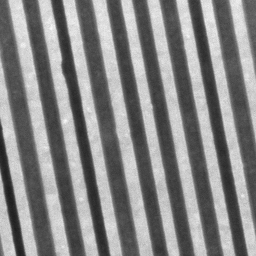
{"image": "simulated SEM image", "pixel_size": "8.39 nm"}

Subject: parallel lines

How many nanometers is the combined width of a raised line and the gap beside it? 227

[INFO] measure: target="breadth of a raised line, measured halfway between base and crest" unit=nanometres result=107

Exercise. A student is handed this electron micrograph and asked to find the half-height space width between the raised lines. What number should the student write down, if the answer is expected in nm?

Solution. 114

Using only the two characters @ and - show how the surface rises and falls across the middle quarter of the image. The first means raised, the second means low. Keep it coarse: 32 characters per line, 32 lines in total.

---@@@----@@@@---@@@----@@@----@
---@@@----@@@@---@@@----@@@----@
---@@@----@@@@----@@----@@@----@
---@@@-----@@@----@@@---@@@@----
@--@@@@----@@@----@@@---@@@@----
@---@@@----@@@@---@@@----@@@----
@---@@@----@@@@---@@@----@@@----
@---@@@----@@@@---@@@@---@@@----
@---@@@-----@@@----@@@---@@@@---
@@--@@@-----@@@----@@@---@@@@---
@@---@@@----@@@----@@@----@@@---
@@---@@@----@@@@---@@@----@@@---
@@---@@@----@@@@---@@@@---@@@---
@@---@@@-----@@@----@@@---@@@---
@@@--@@@-----@@@----@@@---@@@@--
@@@--@@@@----@@@----@@@----@@@--
@@@---@@@----@@@@---@@@----@@@--
@@@---@@@----@@@@---@@@----@@@--
@@@---@@@----@@@@----@@@---@@@--
@@@@--@@@-----@@@----@@@---@@@@-
@@@@--@@@@----@@@----@@@---@@@@-
@@@@---@@@----@@@@---@@@----@@@-
-@@@---@@@----@@@@---@@@----@@@-
-@@@---@@@----@@@@---@@@@---@@@-
-@@@---@@@-----@@@----@@@---@@@-
-@@@@--@@@-----@@@----@@@---@@@@
-@@@@---@@@----@@@----@@@----@@@
-@@@@---@@@----@@@@---@@@----@@@
--@@@---@@@----@@@@---@@@----@@@
--@@@---@@@----@@@@----@@@---@@@
--@@@@--@@@-----@@@----@@@---@@@
--@@@@--@@@@----@@@----@@@---@@@